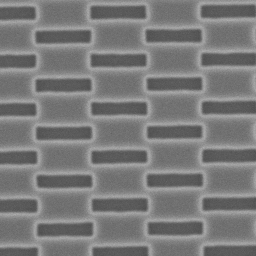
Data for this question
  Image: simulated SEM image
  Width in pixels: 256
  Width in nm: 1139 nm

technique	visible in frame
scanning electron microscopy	groups of lines, slits or small figures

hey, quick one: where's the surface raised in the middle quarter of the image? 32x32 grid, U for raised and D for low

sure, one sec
UUUUUUUDDDDDDDDDDDDDDUUUUUUUUUUU
UUUUUUUUUUUUUUUUUUUUUUUUUUUUUUUU
UUUUUUUUUUUUUUUUUUUUUUUUUUUUUUUU
DDDDDDDUUUUUUUUUUUUUUDDDDDDDDDDD
DDDDDDDUUUUUUUUUUUUUDDDDDDDDDDDD
DDDDDDDUUUUUUUUUUUUUDDDDDDDDDDDD
DDDDDDDUUUUUUUUUUUUUUDDDDDDDDDDD
UUUUUUUUUUUUUUUUUUUUUUUUUUUUUUUU
UUUUUUUUUUUUUUUUUUUUUUUUUUUUUUUU
UUUUUUUDDDDDDDDDDDDDDUUUUUUUUUUU
UUUUUUUDDDDDDDDDDDDDDUUUUUUUUUUU
UUUUUUUDDDDDDDDDDDDDDUUUUUUUUUUU
UUUUUUUDDDDDDDDDDDDDDUUUUUUUUUUU
UUUUUUUUUUUUUUUUUUUUUUUUUUUUUUUU
UUUUUUUUUUUUUUUUUUUUUUUUUUUUUUUU
DDDDDDDUUUUUUUUUUUUUUDDDDDDDDDDD
DDDDDDDUUUUUUUUUUUUUDDDDDDDDDDDD
DDDDDDDUUUUUUUUUUUUUUDDDDDDDDDDD
DDDDDDDUUUUUUUUUUUUUUDDDDDDDDDDD
UUUUUUUUUUUUUUUUUUUUUUUUUUUUUUUU
UUUUUUUUUUUUUUUUUUUUUUUUUUUUUUUU
UUUUUUUDDDDDDDDDDDDDUUUUUUUUUUUU
UUUUUUUDDDDDDDDDDDDDDUUUUUUUUUUU
UUUUUUUDDDDDDDDDDDDDDUUUUUUUUUUU
UUUUUUUDDDDDDDDDDDDDDUUUUUUUUUUU
UUUUUUUUUUUUUUUUUUUUUUUUUUUUUUUU
UUUUUUUUUUUUUUUUUUUUUUUUUUUUUUUU
DDDDDDDUUUUUUUUUUUUUUDDDDDDDDDDD
DDDDDDDUUUUUUUUUUUUUDDDDDDDDDDDD
DDDDDDDUUUUUUUUUUUUUDDDDDDDDDDDD
DDDDDDDUUUUUUUUUUUUUUDDDDDDDDDDD
UUUUUUUUUUUUUUUUUUUUUUUUUUUUUUUU